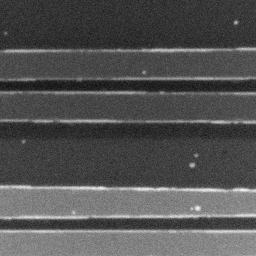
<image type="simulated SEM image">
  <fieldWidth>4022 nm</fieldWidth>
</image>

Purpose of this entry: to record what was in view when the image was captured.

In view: lines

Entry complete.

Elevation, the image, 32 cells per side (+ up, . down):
................................
................................
................................
................................
................................
................................
++++++++++++++++++++++++++++++++
++++++++++++++++++++++++++++++++
++++++++++++++++++++++++++++++++
++++++++++++++++++++++++++++++++
................................
................................
++++++++++++++++++++++++++++++++
++++++++++++++++++++++++++++++++
++++++++++++++++++++++++++++++++
................................
................................
................................
................................
................................
................................
................................
................................
+++++++++++.....................
++++++++++++++++++++++++++++++++
++++++++++++++++++++++++++++++++
++++++++++++++++++++++++++++++++
................................
................................
++++++++++++++++++++++++++++++++
++++++++++++++++++++++++++++++++
++++++++++++++++++++++++++++++++